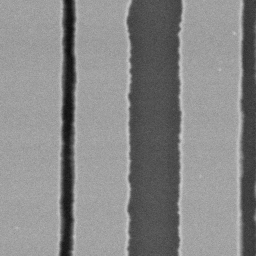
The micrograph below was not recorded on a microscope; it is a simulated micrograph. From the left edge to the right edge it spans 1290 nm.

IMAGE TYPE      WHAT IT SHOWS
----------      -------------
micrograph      lines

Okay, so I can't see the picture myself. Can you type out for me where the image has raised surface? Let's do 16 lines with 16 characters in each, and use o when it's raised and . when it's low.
oooooooo...oooo.
oooooooo...oooo.
oooooooo...oooo.
oooooooo...oooo.
oooooooo...oooo.
oooooooo...oooo.
oooooooo...oooo.
oooooooo...oooo.
oooooooo...oooo.
oooooooo...oooo.
oooooooo...oooo.
oooooooo...oooo.
oooooooo...oooo.
oooooooo...oooo.
oooooooo...oooo.
oooooooo...oooo.